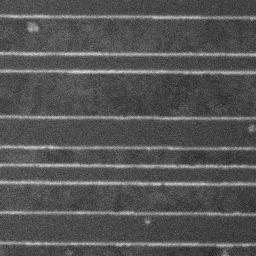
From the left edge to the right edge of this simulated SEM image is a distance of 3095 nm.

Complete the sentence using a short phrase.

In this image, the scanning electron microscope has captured lines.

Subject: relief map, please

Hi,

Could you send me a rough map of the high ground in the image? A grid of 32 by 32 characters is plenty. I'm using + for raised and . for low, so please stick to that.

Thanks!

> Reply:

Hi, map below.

++++++++++++++++++++++++++++++++
++++++++++++++++++++++++++++++++
................................
................................
................................
................................
................................
++++++++++++++++++++++++++++++++
++++++++++++++++++++++++++++++++
................................
................................
................................
................................
................................
................................
++++++++++++++++++++++++++++++++
++++++++++++++++++++++++++++++++
++++++++++++++++++++++++++++++++
.....................+++++++++++
................................
................................
++++++++++++++++++++++++++++++++
++++++++++++++++++++++++++++++++
................................
................................
................................
................................
++++++++++++++++++++++++++++++++
++++++++++++++++++++++++++++++++
++++++++++++++++++++++++++++++++
...+++++++++++++++++++++++++++++
................................